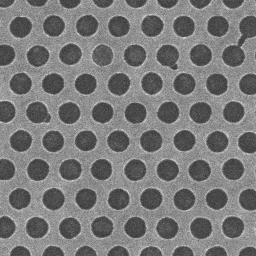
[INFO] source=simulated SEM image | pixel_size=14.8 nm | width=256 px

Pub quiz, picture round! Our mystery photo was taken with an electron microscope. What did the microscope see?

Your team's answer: a regular array of holes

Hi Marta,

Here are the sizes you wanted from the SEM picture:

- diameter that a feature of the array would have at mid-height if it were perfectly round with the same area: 331 nm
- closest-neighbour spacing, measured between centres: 477 nanometers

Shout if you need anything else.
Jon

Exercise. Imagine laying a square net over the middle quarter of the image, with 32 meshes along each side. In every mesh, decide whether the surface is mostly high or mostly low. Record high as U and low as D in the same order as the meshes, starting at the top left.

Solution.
UUUUUUUUUDUUUUUUUDDUUUUUUDDDDUUU
UUUUUUUUUUUUUUUUUUUUUUUUUUUUUUUU
UUUUUDUUUUUUDDDDUUUUDDDDUUUUUDDD
UUUDDDDDUUUDDDDDUUUUDDDDUUUUDDDD
UUUDDDDDUUUDDDDDDUUDDDDDDUUDDDDD
UUUDDDDDUUUDDDDDDUUDDDDDDUUDDDDD
UUUDDDDDUUUDDDDDUUUUDDDDUUUUDDDD
UUUUDDDUUUUUDDDUUUUUUDDUUUUUUDDU
UUUUUUUUUUUUUUUUUUUUUUUUUUUUUUUU
UDUUUUUUUDUUUUUUUDUUUUUUUUDUUUUU
DDDDUUUUDDDDUUUUDDDDUUUUDDDDUUUU
DDDDUUUDDDDDUUUDDDDDDUUDDDDDDUUD
DDDDUUUDDDDDUUUDDDDDDUUDDDDDDUUD
DDDDUUUDDDDDUUUDDDDDUUUUDDDDDUUU
DDDUUUUUDDDUUUUUDDDDUUUUUDDDUUUU
UUUUUUUUUUUUUUUUUUUUUUUUUUUUUUUU
UUUUUUUUUUUUUUUUUUUUUDUUUUUUUUDU
UUUUDDDUUUUUDDDDUUUDDDDDUUUUDDDD
UUUDDDDDUUUDDDDDUUUDDDDDDUUDDDDD
UUUDDDDDUUUDDDDDDUUDDDDDDUUDDDDD
UUUDDDDDUUUDDDDDUUUDDDDDDUUUDDDD
UUUUDDDUUUUUDDDUUUUUDDDUUUUUUDDD
UUUUUUUUUUUUUUUUUUUUUUUUUUUUUUUU
UUUUUUUUUUUUUUUUUUUUUUUUUUUUUUUU
DDDDUUUDDDDUUUUUDDDDUUUUDDDDUUUU
DDDDUUUDDDDDUUUDDDDDUUUDDDDDUUUD
DDDDDUDDDDDDUUUDDDDDDUUDDDDDDUUD
DDDDUUUDDDDDUUUDDDDDUUUDDDDDDUUD
DDDDUUUDDDDUUUUUDDDDUUUUDDDDUUUU
UUUUUUUUUUUUUUUUUUUUUUUUUUUUUUUU
UUUUUUUUUUUUUUUUUUUUUUUUUUUUUUUU
UUUUDDDUUUUUDDDUUUUUDDDDUUUUUDDU